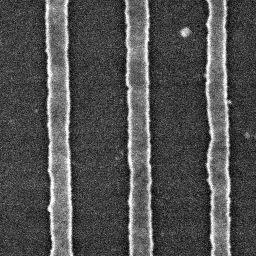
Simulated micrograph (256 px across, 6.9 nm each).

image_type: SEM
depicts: one or a few lines or trenches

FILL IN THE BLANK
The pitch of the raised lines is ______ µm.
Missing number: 0.549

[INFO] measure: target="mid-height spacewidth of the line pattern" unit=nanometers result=411